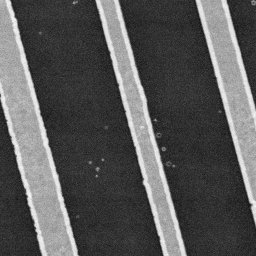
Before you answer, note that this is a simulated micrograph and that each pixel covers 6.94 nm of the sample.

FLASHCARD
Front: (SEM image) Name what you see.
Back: one or a few lines or trenches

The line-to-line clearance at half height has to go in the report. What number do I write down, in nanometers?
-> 596